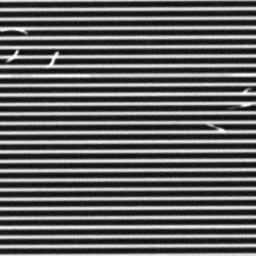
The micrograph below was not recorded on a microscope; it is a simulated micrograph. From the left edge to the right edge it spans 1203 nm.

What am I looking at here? parallel lines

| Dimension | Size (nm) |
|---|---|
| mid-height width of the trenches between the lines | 30.5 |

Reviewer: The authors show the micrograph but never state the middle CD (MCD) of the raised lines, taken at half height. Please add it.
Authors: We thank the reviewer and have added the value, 12.9 nm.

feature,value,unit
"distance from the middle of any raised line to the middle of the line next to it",0.0445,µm